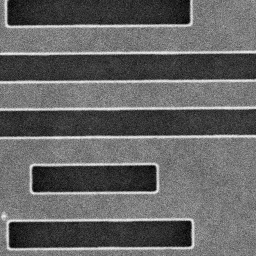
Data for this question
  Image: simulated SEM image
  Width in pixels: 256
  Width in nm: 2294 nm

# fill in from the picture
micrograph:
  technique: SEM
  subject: groups of lines, slits or small figures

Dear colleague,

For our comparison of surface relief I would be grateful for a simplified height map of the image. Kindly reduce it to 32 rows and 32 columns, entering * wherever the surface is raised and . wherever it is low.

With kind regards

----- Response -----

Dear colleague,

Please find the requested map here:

*.......................********
*.......................********
*.......................********
********************************
********************************
********************************
********************************
................................
................................
................................
********************************
********************************
********************************
***************************.....
................................
................................
................................
********************************
********************************
********************************
********************************
****................************
****................************
****................************
********************************
********************************
********************************
************............********
*.......................********
*.......................********
*.......................********
********************************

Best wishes